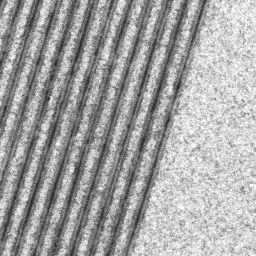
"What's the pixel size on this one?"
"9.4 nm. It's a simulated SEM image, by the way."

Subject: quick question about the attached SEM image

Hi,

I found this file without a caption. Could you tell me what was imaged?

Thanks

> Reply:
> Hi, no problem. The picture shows parallel lines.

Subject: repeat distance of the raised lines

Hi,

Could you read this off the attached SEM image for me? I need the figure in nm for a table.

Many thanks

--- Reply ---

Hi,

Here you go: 166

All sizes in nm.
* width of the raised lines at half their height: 46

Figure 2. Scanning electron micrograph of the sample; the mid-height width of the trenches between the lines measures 122 nanometers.